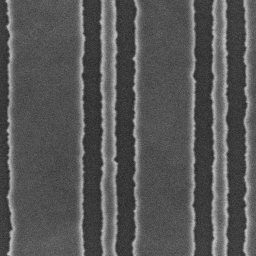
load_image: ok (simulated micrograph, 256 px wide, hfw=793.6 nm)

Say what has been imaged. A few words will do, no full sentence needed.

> lines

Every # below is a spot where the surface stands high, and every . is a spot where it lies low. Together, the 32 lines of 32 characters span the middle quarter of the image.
#####....####.....##############
#####....####.....##############
####.....####.....##############
####.....####.....##############
#####....####.....##############
#####....####....###############
#####....####....###############
#####....####.....##############
####......###.....##############
#####....####.....##############
#####.....###.....##############
#####....####.....##############
#####....####.....##############
#####.....###.....##############
#####.....###....###############
#####....####.....##############
#####.....###....###############
#####.....###....###############
#####.....###.....##############
####.....####.....##############
#####....####.....##############
#####....####.....##############
#####....####.....##############
####......###.....##############
####......###.....##############
#####.....###.....##############
#####....####.....##############
#####.....###.....##############
#####....####....###############
#####....####.....##############
#####....####.....##############
####.....####.....##############